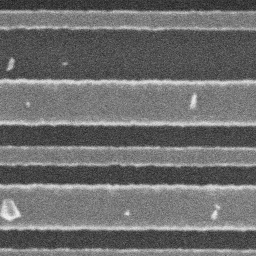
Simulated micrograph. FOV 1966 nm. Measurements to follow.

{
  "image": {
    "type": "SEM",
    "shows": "lines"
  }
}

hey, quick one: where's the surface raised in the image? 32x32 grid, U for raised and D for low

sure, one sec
DDDDDDDDDDDDDDDDDDDDDDDDDDDDDDDD
UUUUUUUUUUUUUDUUUDDDDDDUUDUUDDDD
UUUUUUUUUUUUUUUUUUUUUUUUUUUUUUUU
UUDUUDDUUUUUUUUUUUUUUUUUUUUUUUUU
DDDDDDDDDDDDDDDDDDDDDDDDDDDDDDDD
DDDDDDDDDDDDDDDDDDDDDDDDDDDDDDDD
DDDDDDDDDDDDDDDDDDDDDDDDDDDDDDDD
DDDDDDDDDDDDDDDDDDDDDDDDDDDDDDDD
DDDDDDDDDDDDDDDDDDDDDDDDDDDDDDDD
DDDDDDDDDDDDDDDDDDDDDDDDDDDDDDDD
UUUUUUUUUUUUUUUUUUUUUUUUUUUUUUUU
UUUUUUUUUUUUUUUUUUUUUUUUUUUUUUUU
UUUUUUUUUUUUUUUUUUUUUUUUUUUUUUUU
UUUUUUUUUUUUUUUUUUUUUUUUUUUUUUUU
UUUUUUUUUUUUUUUUUUUUUUUUUUUUUUUU
UUUUUUUUUUUUUUUUUUUUUUUUUUUUUUUU
DDDDDDDDDDDDDDDDDDDDDDDDDDDDDDDD
DDDDDDDDDDDDDDDDDDDDDDDDDDDDDDDD
UUUUUUUUUUUUUUDDDUUUDDDDDDDDDDDD
UUUUUUUUUUUUUUUUUUUUUUUUUUUUUUUU
UUUUUUUUUUUUUUDUUUUUUUUUUUUUUUUU
DDDDDDDDDDDDDDDDDDDDDDDDDDDDDDDD
DDDDDDDDDDDDDDDDDDDDDDDDDDDDDDDD
UUUUUUUUUUUUUUUUUUUUUUUUUUUUUUUU
UUUUUUUUUUUUUUUUUUUUUUUUUUUUUUUU
UUUUUUUUUUUUUUUUUUUUUUUUUUUUUUUU
UUUUUUUUUUUUUUUUUUUUUUUUUUUUUUUU
UUUUUUUUUUUUUUUUUUUUUUUUUUUUUUUU
UUUUUUUUUUUUUUUUUUUUUUUUUUUUUUUU
DDDDDDDDDDDDDDDDDDDDDDDDDDDDDDDD
DDDDDDDDDDDDDDDDDDDDDDDDDDDDDDDD
UUUUUUUUUUUUUUUUUUUUUUUUUUUUUUUU